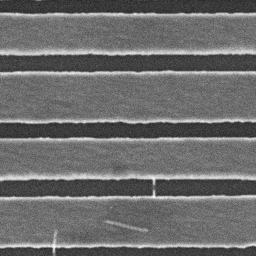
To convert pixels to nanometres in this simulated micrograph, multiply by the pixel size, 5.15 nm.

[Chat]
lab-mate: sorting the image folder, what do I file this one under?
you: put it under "lines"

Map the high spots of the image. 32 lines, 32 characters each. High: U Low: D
DDDDDDDDDDDDDDDDDDDDDDDDDDDDDDDD
DDDDDDDDDDDDDDDDDDDDDDDDDDDDDDDD
UUUUUUUUUUUUUUUUUUUUUUUUUUUUUUUU
UUUUUUUUUUUUUUUUUUUUUUUUUUUUUUUU
UUUUUUUUUUUUUUUUUUUUUUUUUUUUUUUU
UUUUUUUUUUUUUUUUUUUUUUUUUUUUUUUU
UUUUUUUUUUUUUUUUUUUUUUUUUUUUUUUU
DDDDDDDDDDDDDDDDDDDDDDDDDDDDDDDD
DDDDDDDDDDDDDDDDDDDDDDDDDDDDDDDD
UUUUUUUUUUUUUUUUUUUUUUUUUUUUUUUU
UUUUUUUUUUUUUUUUUUUUUUUUUUUUUUUU
UUUUUUUUUUUUUUUUUUUUUUUUUUUUUUUU
UUUUUUUUUUUUUUUUUUUUUUUUUUUUUUUU
UUUUUUUUUUUUUUUUUUUUUUUUUUUUUUUU
UUUUUUUUUUUUUUUUUUUUUUUUUUUUUUUU
DDDDDDDDDDDDDDDDDDDDDDDDDDDDDDDD
DDDDDDDDDDDDDDDDDDDDDDDDDDDDDDDD
UUUUUUUUUUUUUUUUUUUUUUUUUUUUUUUU
UUUUUUUUUUUUUUUUUUUUUUUUUUUUUUUU
UUUUUUUUUUUUUUUUUUUUUUUUUUUUUUUU
UUUUUUUUUUUUUUUUUUUUUUUUUUUUUUUU
UUUUUUUUUUUUUUUUUUUUUUUUUUUUUUUU
UDDDDDDDDDDDDDDDDDDDDDDDDDDDDDDD
DDDDDDDDDDDDDDDDDDDDDDDDDDDDDDDD
DDDDDDDDDDDDDDDDDDDUDDDDDDUUUUUU
UUUUUUUUUUUUUUUUUUUUUUUUUUUUUUUU
UUUUUUUUUUUUUUUUUUUUUUUUUUUUUUUU
UUUUUUUUUUUUUUUUUUUUUUUUUUUUUUUU
UUUUUUUUUUUUUUUUUUUUUUUUUUUUUUUU
UUUUUUUUUUUUUUUUUUUUUUUUUUUUUUUU
UUUUUUUUUUUUUUUUUUUUUUUUUUUUUUUU
DDDDDDDDDDDDDDDDDDDDDDDDDDDDDDDD